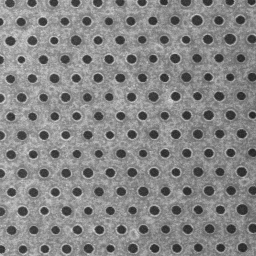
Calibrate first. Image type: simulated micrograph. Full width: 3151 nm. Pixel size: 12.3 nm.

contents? a regular array of holes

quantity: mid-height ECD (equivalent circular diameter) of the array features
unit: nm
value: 119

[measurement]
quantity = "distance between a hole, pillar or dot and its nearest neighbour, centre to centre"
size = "0.267 um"